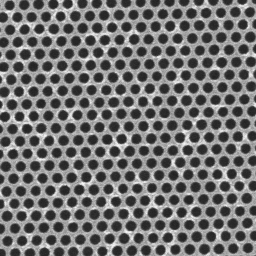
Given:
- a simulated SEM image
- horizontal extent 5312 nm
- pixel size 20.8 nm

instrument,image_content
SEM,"a regular array of holes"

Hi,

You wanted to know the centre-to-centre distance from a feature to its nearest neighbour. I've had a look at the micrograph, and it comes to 292 nm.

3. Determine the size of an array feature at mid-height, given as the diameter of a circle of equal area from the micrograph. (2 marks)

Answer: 232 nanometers